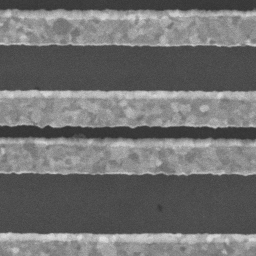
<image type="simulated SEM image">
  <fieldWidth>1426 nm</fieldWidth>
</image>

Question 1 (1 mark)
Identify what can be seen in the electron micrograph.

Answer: lines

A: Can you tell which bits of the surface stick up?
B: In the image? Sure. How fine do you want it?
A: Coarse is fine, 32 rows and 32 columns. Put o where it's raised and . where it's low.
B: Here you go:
................................
.o......................o...o...
oooooooooooooooooooooooooooooooo
oooooooooooooooooooooooooooooooo
oooooooooooooooooooooooooooooooo
oo.ooooooooooooooooooooooooooooo
................................
................................
................................
................................
................................
................................
oooooooooooooooooooooooooooooooo
oooooooooooooooooooooooooooooooo
oooooooooooooooooooooooooooooooo
oooooooooooooooooooooooooooooooo
................................
oooooooooo...o..................
oooooooooooooooooooooooooooooooo
oooooooooooooooooooooooooooooooo
oooooooooooooooooooooooooooooooo
oooooooooooooooooooooooooooooooo
................................
................................
................................
................................
................................
................................
................................
ooooo.oooooo........o...........
oooooooooooooooooooooooooooooooo
oooooooooooooooooooooooooooooooo